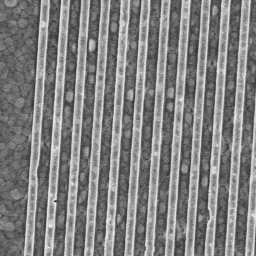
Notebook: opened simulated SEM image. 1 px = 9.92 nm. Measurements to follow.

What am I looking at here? parallel lines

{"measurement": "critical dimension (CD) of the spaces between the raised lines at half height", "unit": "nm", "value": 119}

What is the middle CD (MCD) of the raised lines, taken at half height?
0.0816 um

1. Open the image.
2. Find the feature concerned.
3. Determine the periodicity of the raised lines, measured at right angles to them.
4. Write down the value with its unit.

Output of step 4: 199 nm